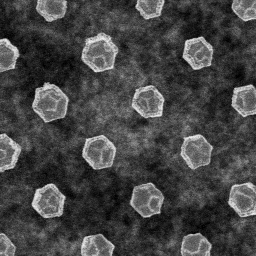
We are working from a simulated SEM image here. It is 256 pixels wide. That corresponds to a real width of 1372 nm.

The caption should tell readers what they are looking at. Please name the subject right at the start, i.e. a regular array of raised bodies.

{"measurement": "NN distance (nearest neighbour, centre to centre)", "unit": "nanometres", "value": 370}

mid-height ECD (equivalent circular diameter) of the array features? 171 nm